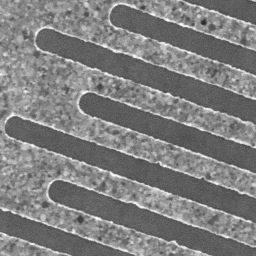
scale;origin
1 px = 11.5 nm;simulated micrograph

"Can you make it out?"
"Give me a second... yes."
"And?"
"parallel lines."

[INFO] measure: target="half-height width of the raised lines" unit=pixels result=22.9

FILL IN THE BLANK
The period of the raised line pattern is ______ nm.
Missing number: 538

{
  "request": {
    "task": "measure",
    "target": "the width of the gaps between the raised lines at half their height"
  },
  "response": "0.267 microns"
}